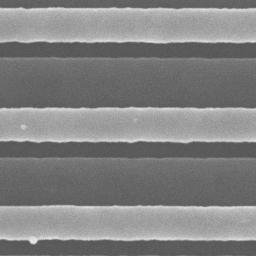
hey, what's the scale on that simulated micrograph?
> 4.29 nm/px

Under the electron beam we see lines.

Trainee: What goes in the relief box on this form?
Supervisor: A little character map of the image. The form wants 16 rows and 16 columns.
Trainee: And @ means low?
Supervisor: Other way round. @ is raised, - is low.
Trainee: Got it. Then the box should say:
---@--@@@-------
@@@@@@@@@@@@@@@@
@@@@@@@@@@@@@@@@
----------------
----------------
----------------
----------------
@@@@@@@@@@@@@@@@
@@@@@@@@@@@@@@@@
----------------
----------------
----------------
----------------
@@@@@@@@@@@@@@@@
@@@@@@@@@@@@@@@@
----------------